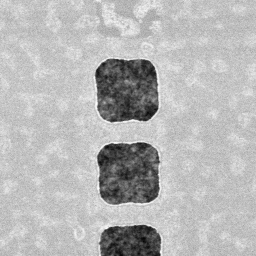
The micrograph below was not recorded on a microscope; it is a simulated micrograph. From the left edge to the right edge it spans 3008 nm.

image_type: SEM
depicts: holes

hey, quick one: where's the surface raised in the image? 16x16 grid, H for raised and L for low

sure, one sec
HHHHHHHHHHHHHHHH
HHHHHHHHHHHHHHHH
HHHHHHHHHHHHHHHH
HHHHHHHHHHHHHHHH
HHHHHHLLLLHHHHHH
HHHHHHLLLLHHHHHH
HHHHHHLLLLHHHHHH
HHHHHHLLLHHHHHHH
HHHHHHHHHHHHHHHH
HHHHHHLLLLHHHHHH
HHHHHHLLLLHHHHHH
HHHHHHLLLLHHHHHH
HHHHHHHLLLHHHHHH
HHHHHHHHHHHHHHHH
HHHHHHHLLLHHHHHH
HHHHHHLLLLHHHHHH